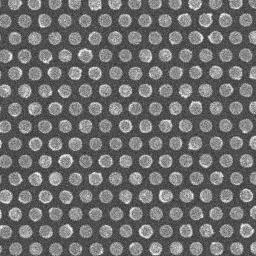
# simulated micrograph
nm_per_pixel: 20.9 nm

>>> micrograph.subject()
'a regular array of raised bodies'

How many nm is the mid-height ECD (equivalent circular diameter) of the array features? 272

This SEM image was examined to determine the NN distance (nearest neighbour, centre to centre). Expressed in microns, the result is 0.413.